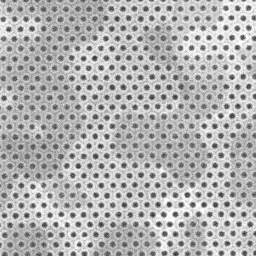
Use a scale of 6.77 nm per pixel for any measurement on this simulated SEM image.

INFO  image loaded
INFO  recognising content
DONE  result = a regular array of holes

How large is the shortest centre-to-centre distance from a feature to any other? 0.0739 microns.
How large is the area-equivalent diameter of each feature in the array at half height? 48.3 nanometres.